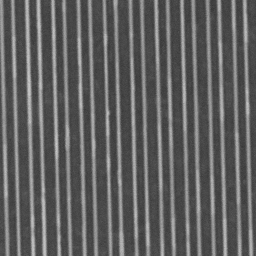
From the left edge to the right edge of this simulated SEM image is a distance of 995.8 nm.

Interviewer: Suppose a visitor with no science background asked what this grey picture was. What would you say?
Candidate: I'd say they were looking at parallel lines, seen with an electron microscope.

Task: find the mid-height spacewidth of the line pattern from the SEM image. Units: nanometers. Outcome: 37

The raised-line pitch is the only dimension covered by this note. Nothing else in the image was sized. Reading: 49.9 nanometres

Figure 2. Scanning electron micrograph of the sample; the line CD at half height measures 11.2 nanometres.